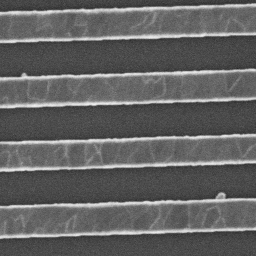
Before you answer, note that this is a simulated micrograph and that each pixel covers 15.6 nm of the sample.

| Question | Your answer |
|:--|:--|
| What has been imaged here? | lines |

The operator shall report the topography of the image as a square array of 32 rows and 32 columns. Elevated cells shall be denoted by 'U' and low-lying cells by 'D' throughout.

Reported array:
DDDDDDDDDDDDDDDDDDDDDDDDDDDDDDDD
DUUUUUUUUUUUUUUUUUUUUUUUUUUUUUUU
UUUUUUUUUUUUUUUUUUUUUUUUUUUUUUUU
UUUUUUUUUUUUUUUUUUUUUUUUUUUUUUUU
UUUUUUUUUUUUUUUUUUUUUUUUUDDDDDDD
DDDDDDDDDDDDDDDDDDDDDDDDDDDDDDDD
DDDDDDDDDDDDDDDDDDDDDDDDDDDDDDDD
DDDDDDDDDDDDDDDDDDDDDDDDDDDDDDDD
DDDDDDDDDDDDDDDDDDDDDDDDDDDDDDDD
DDDDDDDDDDUUUUUUUUUUUUUUUUUUUUUU
UUUUUUUUUUUUUUUUUUUUUUUUUUUUUUUU
UUUUUUUUUUUUUUUUUUUUUUUUUUUUUUUU
UUUUUUUUUUUUUUUUUUUUUUUUUUUUDDDD
DDDDDDDDDDDDDDDDDDDDDDDDDDDDDDDD
DDDDDDDDDDDDDDDDDDDDDDDDDDDDDDDD
DDDDDDDDDDDDDDDDDDDDDDDDDDDDDDDD
DDDDDDDDDDDDDDDDDDDDDDDDDDDDDDDD
DDDDDDDDDDDUUUUUUUUUUUUUUUUUUUUU
UUUUUUUUUUUUUUUUUUUUUUUUUUUUUUUU
UUUUUUUUUUUUUUUUUUUUUUUUUUUUUUUU
UUUUUUUUUUUUUUUUUUUUUUUUUUUDDDDD
DDDDDDDDDDDDDDDDDDDDDDDDDDDDDDDD
DDDDDDDDDDDDDDDDDDDDDDDDDDDDDDDD
DDDDDDDDDDDDDDDDDDDDDDDDDDDDDDDD
DDDDDDDDDDDDDDDDDDDDDDDDDDDDDDDD
DDDDDDDDDDDDDUUUUUUUUUUUUUUUUUUU
UUUUUUUUUUUUUUUUUUUUUUUUUUUUUUUU
UUUUUUUUUUUUUUUUUUUUUUUUUUUUUUUU
UUUUUUUUUUUUUUUUUUUUUUUUUUUUUUUU
UUUUUUDDDDDDDDDDDDDDDDDDDDDDDDDD
DDDDDDDDDDDDDDDDDDDDDDDDDDDDDDDD
DDDDDDDDDDDDDDDDDDDDDDDDDDDDDDDD